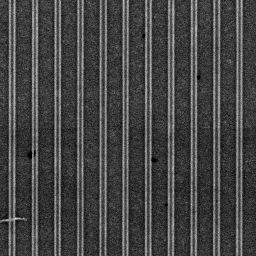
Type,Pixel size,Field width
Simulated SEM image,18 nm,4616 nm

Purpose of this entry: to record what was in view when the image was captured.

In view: parallel lines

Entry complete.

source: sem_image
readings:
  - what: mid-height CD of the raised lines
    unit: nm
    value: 83.4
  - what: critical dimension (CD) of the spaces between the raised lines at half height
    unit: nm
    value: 320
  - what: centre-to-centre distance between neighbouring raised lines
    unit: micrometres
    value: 0.41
